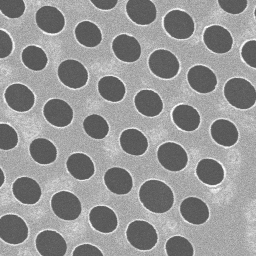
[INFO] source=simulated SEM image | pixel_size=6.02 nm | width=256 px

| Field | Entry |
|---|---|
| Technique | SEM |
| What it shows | a regular array of holes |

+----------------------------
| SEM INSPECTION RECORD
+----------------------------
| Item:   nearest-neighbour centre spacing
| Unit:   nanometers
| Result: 245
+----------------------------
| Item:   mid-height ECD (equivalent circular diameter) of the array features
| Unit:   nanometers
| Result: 170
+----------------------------